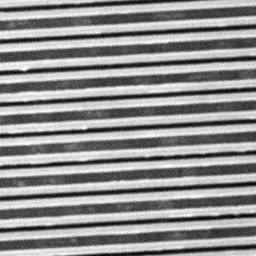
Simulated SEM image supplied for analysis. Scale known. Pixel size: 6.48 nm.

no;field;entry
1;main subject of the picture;parallel lines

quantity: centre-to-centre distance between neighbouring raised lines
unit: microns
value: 0.103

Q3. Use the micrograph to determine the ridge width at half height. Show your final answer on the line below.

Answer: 44.5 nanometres